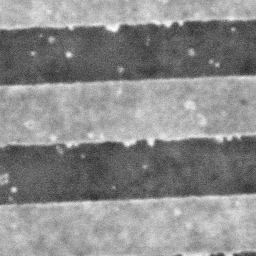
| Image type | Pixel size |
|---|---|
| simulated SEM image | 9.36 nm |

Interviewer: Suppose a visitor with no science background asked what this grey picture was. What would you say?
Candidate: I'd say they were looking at lines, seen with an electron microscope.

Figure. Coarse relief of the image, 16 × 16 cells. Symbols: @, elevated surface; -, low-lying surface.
@@@@@@@@@@@@@@@@
@@@@@@@@@-------
----------------
----------------
----------------
@@@@@@@@@@@@@@@@
@@@@@@@@@@@@@@@@
@@@@@@@@@@@@@@@@
@@@@@@@@@@@@@@--
----------------
----------------
----------------
---------@@@@@@@
@@@@@@@@@@@@@@@@
@@@@@@@@@@@@@@@@
@@@@@@@@@@@@@@@@